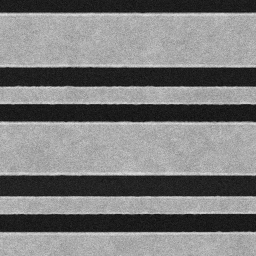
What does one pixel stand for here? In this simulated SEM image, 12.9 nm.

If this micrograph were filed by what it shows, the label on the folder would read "lines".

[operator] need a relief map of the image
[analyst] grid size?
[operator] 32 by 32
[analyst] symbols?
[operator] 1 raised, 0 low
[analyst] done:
00000000000000000000000000000000
00000000000000000000000000000000
11111111111111111111111111111111
11111111111111111111111111111111
11111111111111111111111111111111
11111111111111111111111111111111
11111111111111111111111111111111
11111111111111111111111111111111
00000000000000000000000000000000
00000000000000000000000000000000
00000000000000000000000000000000
11111111111111111111111111111111
11111111111111111111111111111111
00000000000000000000000000000000
00000000000000000000000000000000
11111111111111111111111111111111
11111111111111111111111111111111
11111111111111111111111111111111
11111111111111111111111111111111
11111111111111111111111111111111
11111111111111111111111111111111
11111111111111111111111111111111
00000000000000000000000000000000
00000000000000000000000000000000
00000000000000000000000000000000
11111111111111111111111111111111
11111111111111111111111111111111
00000000000000000000000000000000
00000000000000000000000000000000
11111111111111111111111111111111
11111111111111111111111111111111
11111111111111111111111111111111